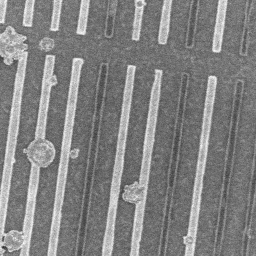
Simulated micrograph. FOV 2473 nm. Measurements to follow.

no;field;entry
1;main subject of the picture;parallel lines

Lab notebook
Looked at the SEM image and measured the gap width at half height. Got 199 nm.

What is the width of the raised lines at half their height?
65.8 nanometres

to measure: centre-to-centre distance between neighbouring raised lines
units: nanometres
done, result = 263